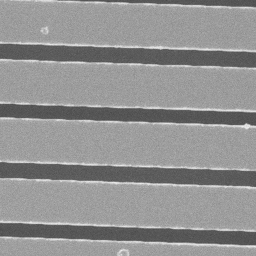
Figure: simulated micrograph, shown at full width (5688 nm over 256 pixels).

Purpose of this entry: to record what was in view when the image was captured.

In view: lines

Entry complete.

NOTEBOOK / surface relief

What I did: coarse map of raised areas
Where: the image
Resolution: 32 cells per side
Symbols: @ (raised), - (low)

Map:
@@@@@@@@@@@@@@@@@@@@------------
@@@@@@@@@@@@@@@@@@@@@@@@@@@@@@@@
@@@@@@@@@@@@@@@@@@@@@@@@@@@@@@@@
@@@@@@@@@@@@@@@@@@@@@@@@@@@@@@@@
@@@@@@@@@@@@@@@@@@@@@@@@@@@@@@@@
-----@@@@@@@@@@@@@@@@@@@@@@@@@@@
--------------------------------
@@------------------------------
@@@@@@@@@@@@@@@@@@@@@@@@@@@@@@--
@@@@@@@@@@@@@@@@@@@@@@@@@@@@@@@@
@@@@@@@@@@@@@@@@@@@@@@@@@@@@@@@@
@@@@@@@@@@@@@@@@@@@@@@@@@@@@@@@@
@@@@@@@@@@@@@@@@@@@@@@@@@@@@@@@@
-----------------@@@@@@@@@@@@@@@
--------------------------------
@@@@@@@@@@@@@@@@@@@@@@----------
@@@@@@@@@@@@@@@@@@@@@@@@@@@@@@@@
@@@@@@@@@@@@@@@@@@@@@@@@@@@@@@@@
@@@@@@@@@@@@@@@@@@@@@@@@@@@@@@@@
@@@@@@@@@@@@@@@@@@@@@@@@@@@@@@@@
-------@@@@@@@@@@@@@@@@@@@@@@@@@
--------------------------------
@@@@@@@-------------------------
@@@@@@@@@@@@@@@@@@@@@@@@@@@@@@@@
@@@@@@@@@@@@@@@@@@@@@@@@@@@@@@@@
@@@@@@@@@@@@@@@@@@@@@@@@@@@@@@@@
@@@@@@@@@@@@@@@@@@@@@@@@@@@@@@@@
@@@@@@@@@@@@@@@@@@@@@@@@@@@@@@@@
---------------------@@@@@@@@@@@
--------------------------------
@@@@@@@@@@@@@@@@@@@@@@@@--------
@@@@@@@@@@@@@@@@@@@@@@@@@@@@@@@@